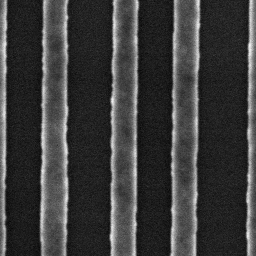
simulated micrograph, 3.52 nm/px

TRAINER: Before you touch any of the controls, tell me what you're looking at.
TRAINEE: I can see lines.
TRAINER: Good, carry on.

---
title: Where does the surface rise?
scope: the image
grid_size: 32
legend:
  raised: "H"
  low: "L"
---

HLLLLHHHLLLLLLHHHLLLLLHHHLLLLLLH
HLLLLHHHLLLLLLHHHLLLLLHHHLLLLLLH
HLLLLHHHLLLLLLHHHLLLLLHHHLLLLLLH
HLLLLHHHLLLLLLHHHLLLLLHHHLLLLLLH
HLLLLHHHLLLLLLHHHLLLLLHHHLLLLLLH
HLLLLHHHLLLLLLHHHLLLLLHHHLLLLLLH
HLLLLHHHLLLLLLHHHLLLLLHHHLLLLLLH
HLLLLHHHLLLLLLHHHLLLLLHHHLLLLLLH
HLLLLHHHLLLLLLHHHLLLLLHHHLLLLLLH
HLLLLHHHLLLLLLHHHLLLLLHHHLLLLLLH
HLLLLHHHLLLLLLHHHLLLLLHHHLLLLLLH
HLLLLHHHLLLLLLHHHLLLLLHHHLLLLLLH
HLLLLHHHLLLLLLHHHLLLLLHHHLLLLLLH
HLLLLHHHLLLLLLHHHLLLLLHHHLLLLLLH
HLLLLHHHLLLLLLHHHLLLLLHHHLLLLLLH
HLLLLHHHLLLLLLHHHLLLLLHHHLLLLLLH
HLLLLHHHLLLLLLHHHLLLLLHHHLLLLLLH
HLLLLHHHLLLLLLHHHLLLLLHHHLLLLLLH
HLLLLHHHLLLLLLHHHLLLLHHHHLLLLLLH
HLLLLHHHLLLLLLHHHLLLLHHHHLLLLLLH
HLLLLHHHLLLLLLHHHLLLLHHHHLLLLLLH
HLLLLHHHLLLLLLHHHLLLLHHHHLLLLLLH
HLLLLHHHLLLLLLHHHLLLLLHHHLLLLLLH
HLLLLHHHLLLLLLHHHLLLLLHHHLLLLLLH
HLLLLHHHLLLLLLHHHLLLLLHHHLLLLLLH
HLLLLHHHLLLLLLHHHLLLLLHHHLLLLLLH
HLLLLHHHLLLLLLHHHLLLLHHHLLLLLLLH
HLLLLHHHLLLLLLHHHLLLLLHHHLLLLLLH
HLLLLHHHLLLLLLHHHLLLLHHHHLLLLLLH
HLLLLHHHLLLLLLHHHLLLLHHHLLLLLLLH
HLLLLHHHLLLLLLHHHLLLLHHHLLLLLLLH
HLLLLHHHLLLLLLHHHLLLLHHHLLLLLLLH